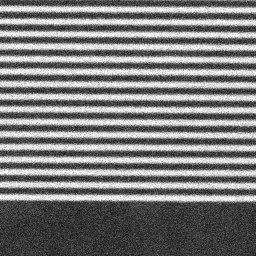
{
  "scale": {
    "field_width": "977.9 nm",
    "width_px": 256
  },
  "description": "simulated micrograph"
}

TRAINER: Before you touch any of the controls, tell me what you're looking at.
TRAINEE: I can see parallel lines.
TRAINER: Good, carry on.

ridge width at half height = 20.5 nanometers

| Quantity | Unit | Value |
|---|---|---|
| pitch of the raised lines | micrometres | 0.048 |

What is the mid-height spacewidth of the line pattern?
27.7 nm